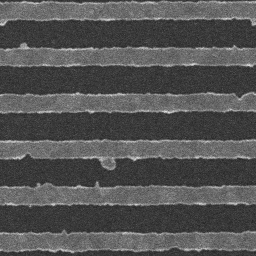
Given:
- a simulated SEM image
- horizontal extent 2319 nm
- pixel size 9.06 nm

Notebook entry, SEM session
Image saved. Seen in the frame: parallel lines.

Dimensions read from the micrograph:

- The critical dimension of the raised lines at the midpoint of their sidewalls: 0.155 microns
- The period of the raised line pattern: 418 nm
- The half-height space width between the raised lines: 260 nm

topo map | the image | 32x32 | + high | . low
++++++++++++++++++++++++++++++++
++++++++++++++++++++++++++++++++
+...+........+.................+
................................
................................
................................
++++++++++++++++++++++++++++++++
++++++++++++++++++++++++++++++++
................................
................................
................................
................................
++++++++++++++++++++++++++++++++
++++++++++++++++++++++++++++++++
................................
................................
................................
................................
++++++++++++++++++++++++++++++++
+++.++++++++++++++++++++++++++++
.............+..................
................................
................................
+++++++++++++.++++++++++++++++++
++++++++++++++++++++++++++++++++
+++++++.+...+++++++++..+.+...++.
................................
................................
................................
++++++++++++++++++++++++++++++++
++++++++++++++++++++++++++++++++
................................